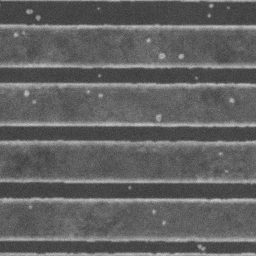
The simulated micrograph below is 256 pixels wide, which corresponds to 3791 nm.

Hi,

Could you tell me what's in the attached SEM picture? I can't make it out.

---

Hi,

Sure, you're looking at lines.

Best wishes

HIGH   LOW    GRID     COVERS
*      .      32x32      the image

................................
................................
................................
********************************
********************************
********************************
********************************
********************************
................................
................................
................................
********************************
********************************
********************************
********************************
.....***************************
................................
................................
********************************
********************************
********************************
********************************
********************************
................................
................................
********************************
********************************
********************************
********************************
********************************
................................
................................